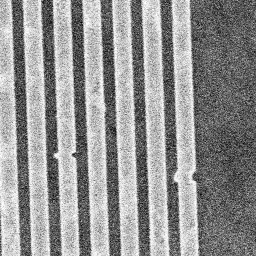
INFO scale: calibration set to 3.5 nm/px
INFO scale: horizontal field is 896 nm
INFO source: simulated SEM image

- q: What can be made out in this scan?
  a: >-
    parallel lines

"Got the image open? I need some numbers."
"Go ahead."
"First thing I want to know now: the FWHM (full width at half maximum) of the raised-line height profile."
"0.0595 µm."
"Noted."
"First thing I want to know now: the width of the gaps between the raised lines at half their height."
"0.042 um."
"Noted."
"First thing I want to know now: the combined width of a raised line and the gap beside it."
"0.104 um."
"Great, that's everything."